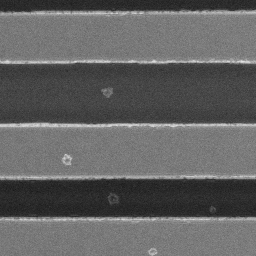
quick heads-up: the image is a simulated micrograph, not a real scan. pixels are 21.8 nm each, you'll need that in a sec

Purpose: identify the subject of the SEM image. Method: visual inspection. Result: lines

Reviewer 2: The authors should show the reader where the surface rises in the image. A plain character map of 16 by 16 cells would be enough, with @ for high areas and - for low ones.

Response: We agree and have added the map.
----------------
@@@@@@@@@@@@@@@@
@@@@@@@@@@@@@@@@
@@@@@@@@@@@@@@@@
----------------
----------------
----------------
----------------
@@@@@@@@@@@@@@@@
@@@@@@@@@@@@@@@@
@@@@@@@@@@@@@@@@
----------------
----------------
----------------
@@@@@@@@@@@@@@@@
@@@@@@@@@@@@@@@@